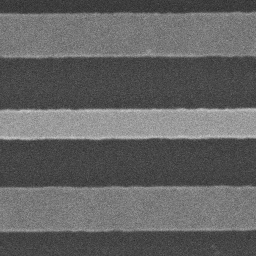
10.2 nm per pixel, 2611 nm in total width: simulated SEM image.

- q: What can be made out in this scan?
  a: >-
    lines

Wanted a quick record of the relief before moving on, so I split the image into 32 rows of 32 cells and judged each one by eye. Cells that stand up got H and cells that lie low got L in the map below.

LLLLLLLLLLLLLLLLLLLLLLLLLLLLLLLL
LLLLLLLLLLLLLLLLLLLLLLLLLLLLLLLL
HHHHHHHHHHHHHHHHHHHHHHHHHHHHHHHH
HHHHHHHHHHHHHHHHHHHHHHHHHHHHHHHH
HHHHHHHHHHHHHHHHHHHHHHHHHHHHHHHH
HHHHHHHHHHHHHHHHHHHHHHHHHHHHHHHH
HHHHHHHHHHHHHHHHHHHHHHHHHHHHHHHH
LLLLLLLLLLLLLLLLLLLLLLLLLLLLLLLL
LLLLLLLLLLLLLLLLLLLLLLLLLLLLLLLL
LLLLLLLLLLLLLLLLLLLLLLLLLLLLLLLL
LLLLLLLLLLLLLLLLLLLLLLLLLLLLLLLL
LLLLLLLLLLLLLLLLLLLLLLLLLLLLLLLL
LLLLLLLLLLLLLLLLLLLLLLLLLLLLLLLL
LLLLLLLLLLLLLLLLLLLLLLLLLLLLLLLL
HHHHHHHHHHHHHHHHHHHHHHHHHHHHHHHH
HHHHHHHHHHHHHHHHHHHHHHHHHHHHHHHH
HHHHHHHHHHHHHHHHHHHHHHHHHHHHHHHH
LLLLLLLLLLLLLLLLLLLLLLLLLLLLLLLL
LLLLLLLLLLLLLLLLLLLLLLLLLLLLLLLL
LLLLLLLLLLLLLLLLLLLLLLLLLLLLLLLL
LLLLLLLLLLLLLLLLLLLLLLLLLLLLLLLL
LLLLLLLLLLLLLLLLLLLLLLLLLLLLLLLL
LLLLLLLLLLLLLLLLLLLLLLLLLLLLLLLL
LLLLLHHHHLLLLHHHHHHHHHHHHHHHHHHH
HHHHHHHHHHHHHHHHHHHHHHHHHHHHHHHH
HHHHHHHHHHHHHHHHHHHHHHHHHHHHHHHH
HHHHHHHHHHHHHHHHHHHHHHHHHHHHHHHH
HHHHHHHHHHHHHHHHHHHHHHHHHHHHHHHH
HHHHHHHHHHHHHHHHHHHHHHHHHHHHHHHH
LLLLLLLLLLLLLLLLLLLLLLLLLLLLLLLL
LLLLLLLLLLLLLLLLLLLLLLLLLLLLLLLL
LLLLLLLLLLLLLLLLLLLLLLLLLLLLLLLL